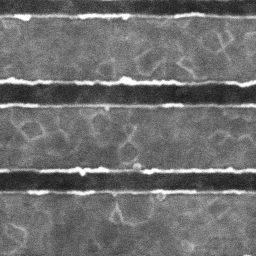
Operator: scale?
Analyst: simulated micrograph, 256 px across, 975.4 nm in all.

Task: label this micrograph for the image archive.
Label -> one or a few lines or trenches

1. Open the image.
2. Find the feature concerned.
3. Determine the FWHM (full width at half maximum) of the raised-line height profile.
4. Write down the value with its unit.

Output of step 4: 92 nm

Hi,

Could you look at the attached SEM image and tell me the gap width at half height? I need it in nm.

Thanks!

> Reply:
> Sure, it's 240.